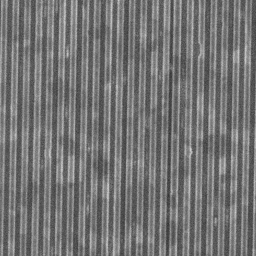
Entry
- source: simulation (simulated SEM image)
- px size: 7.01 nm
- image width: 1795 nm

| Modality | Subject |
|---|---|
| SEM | parallel lines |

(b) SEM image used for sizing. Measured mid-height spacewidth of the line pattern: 42.1 nm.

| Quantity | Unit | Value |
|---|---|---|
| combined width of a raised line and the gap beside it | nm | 81.6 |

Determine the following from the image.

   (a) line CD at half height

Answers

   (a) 42.1 nm